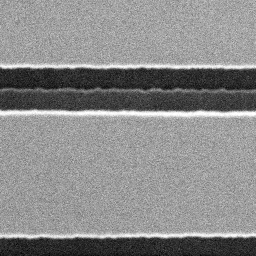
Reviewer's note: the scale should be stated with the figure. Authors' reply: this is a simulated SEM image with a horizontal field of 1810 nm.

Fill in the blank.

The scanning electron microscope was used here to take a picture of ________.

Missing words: lines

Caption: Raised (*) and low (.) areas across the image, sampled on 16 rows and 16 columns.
****************
****************
****************
****************
................
................
................
****************
****************
****************
****************
****************
****************
****************
****************
................